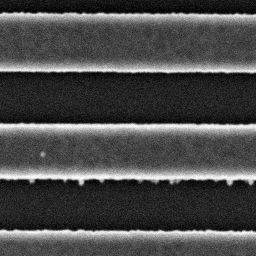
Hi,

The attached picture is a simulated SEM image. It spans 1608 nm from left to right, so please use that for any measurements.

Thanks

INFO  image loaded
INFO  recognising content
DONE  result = lines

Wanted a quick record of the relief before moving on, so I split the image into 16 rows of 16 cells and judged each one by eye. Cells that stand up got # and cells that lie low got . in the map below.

................
################
################
################
...............#
................
................
................
################
################
################
................
................
................
################
################